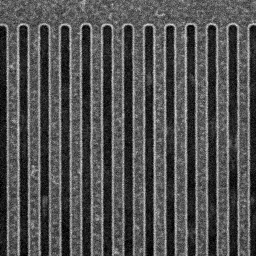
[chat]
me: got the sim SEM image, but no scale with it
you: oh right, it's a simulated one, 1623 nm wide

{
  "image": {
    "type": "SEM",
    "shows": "parallel lines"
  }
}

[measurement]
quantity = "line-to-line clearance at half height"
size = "64.2 nanometres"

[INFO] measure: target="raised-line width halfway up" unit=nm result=69.7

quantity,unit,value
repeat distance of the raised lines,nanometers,133